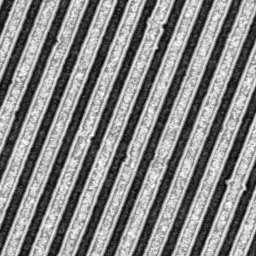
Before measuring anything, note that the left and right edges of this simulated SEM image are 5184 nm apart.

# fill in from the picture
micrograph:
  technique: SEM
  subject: parallel lines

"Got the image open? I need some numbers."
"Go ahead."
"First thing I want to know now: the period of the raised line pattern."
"538 nm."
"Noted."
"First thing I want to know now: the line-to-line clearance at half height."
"233 nanometers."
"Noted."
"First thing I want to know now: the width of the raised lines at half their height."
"14.3 pixels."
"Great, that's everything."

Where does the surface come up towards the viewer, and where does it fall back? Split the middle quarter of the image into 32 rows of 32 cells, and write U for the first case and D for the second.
DDDUUUUDDDUUUUDDDUUUUDDDUUUUDDDU
DDUUUUDDDUUUUUDDDUUUUDDDUUUUDDDU
DDUUUUDDDUUUUDDDUUUUDDDUUUUUDDDU
DDUUUUDDDUUUUDDDUUUUDDDUUUUDDDUU
DUUUUDDDUUUUDDDUUUUUDDDUUUUDDDUU
DUUUUDDDUUUUDDDUUUUDDDUUUUDDDUUU
DUUUDDDDUUUUDDDUUUUDDDUUUUDDDUUU
UUUUDDDUUUUDDDUUUUDDDDUUUDDDDUUU
UUUUDDDUUUUDDDUUUUDDDUUUUDDDUUUU
UUUDDDUUUUDDDDUUUUDDDUUUUDDDUUUU
UUUDDDUUUUDDDUUUUDDDUUUUDDDDUUUD
UUDDDDUUUUDDDUUUUDDDUUUUDDDUUUUD
UUDDDUUUUDDDUUUUDDDDUUUDDDDUUUUD
UUDDDUUUUDDDUUUUDDDUUUUDDDUUUUDD
UDDDUUUUDDDDUUUUDDDUUUUDDDUUUUDD
UDDDUUUUDDDUUUUDDDUUUUDDDDUUUUDD
UDDDUUUUDDDUUUUDDDUUUUDDDUUUUDDD
DDDUUUUUDDUUUUDDDDUUUDDDDUUUUDDD
DDDUUUUDDDUUUUDDDUUUUDDDUUUUDDDD
DDUUUUDDDDUUUUDDDUUUUDDDUUUUDDDU
DDUUUUDDDUUUUDDDUUUUDDDDUUUUDDDU
DDUUUUDDDUUUUDDDUUUUDDDUUUUDDDUU
DUUUUDDDUUUUUDDDUUUUDDDUUUUDDDUU
DUUUUDDDUUUUDDDDUUUDDDDUUUDDDDUU
DUUUUDDDUUUUDDDUUUUDDDUUUUDDDUUU
UUUUDDDUUUUDDDUUUUUDDDUUUDDDDUUU
UUUUDDDUUUUDDDUUUUDDDUUUUDDDUUUU
UUUDDDDUUUUDDDUUUUDDDUUUUDDDUUUU
UUUDDDUUUUDDDUUUUDDDUUUUDDDDUUUD
UUUDDDUUUUDDDUUUUDDDUUUUDDDUUUUD
UUDDDUUUUDDDDUUUDDDDUUUDDDDUUUUD
UUDDDUUUUDDDUUUUDDDUUUUDDDUUUUDD